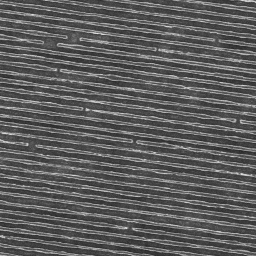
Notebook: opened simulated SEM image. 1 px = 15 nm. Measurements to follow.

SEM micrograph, parallel lines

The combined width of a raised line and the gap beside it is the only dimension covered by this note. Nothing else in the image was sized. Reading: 130 nm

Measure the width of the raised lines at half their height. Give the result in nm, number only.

40.9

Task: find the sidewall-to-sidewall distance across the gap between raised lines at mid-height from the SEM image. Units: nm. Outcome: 94.9